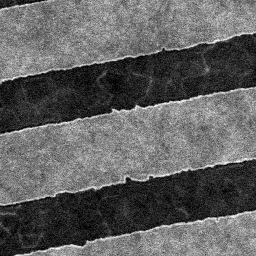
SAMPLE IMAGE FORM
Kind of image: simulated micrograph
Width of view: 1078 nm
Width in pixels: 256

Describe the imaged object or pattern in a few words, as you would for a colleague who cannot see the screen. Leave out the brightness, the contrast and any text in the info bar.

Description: one or a few lines or trenches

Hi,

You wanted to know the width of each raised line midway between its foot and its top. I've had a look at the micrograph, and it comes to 0.295 µm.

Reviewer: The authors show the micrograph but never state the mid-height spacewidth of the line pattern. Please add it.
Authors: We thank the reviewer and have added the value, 221 nm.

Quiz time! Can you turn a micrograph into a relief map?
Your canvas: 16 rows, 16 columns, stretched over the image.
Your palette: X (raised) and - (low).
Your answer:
XXXXXXXXXXXXXXXX
XXXXXXXXXXXXXXXX
XXXXXXXXXXXXXX--
XXXXXXXXX-------
XXX-------------
--X-------------
----------XXXXXX
-----XXXXXXXXXXX
XXXXXXXXXXXXXXXX
XXXXXXXXXXXXXXXX
XXXXXXXXXXXXX-X-
XXXXXXX---------
XX--------------
--------------XX
---------XXXXXXX
---XXXXXXXXXXXXX